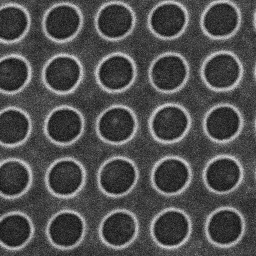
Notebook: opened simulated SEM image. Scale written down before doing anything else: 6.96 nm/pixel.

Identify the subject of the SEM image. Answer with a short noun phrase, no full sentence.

a regular array of holes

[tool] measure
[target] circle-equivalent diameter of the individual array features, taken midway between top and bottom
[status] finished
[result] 0.248 microns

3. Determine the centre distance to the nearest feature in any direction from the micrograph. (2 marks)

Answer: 51.7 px